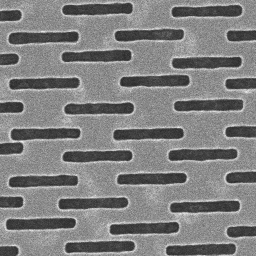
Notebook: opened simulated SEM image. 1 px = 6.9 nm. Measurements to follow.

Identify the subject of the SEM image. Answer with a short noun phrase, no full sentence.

a regular array of holes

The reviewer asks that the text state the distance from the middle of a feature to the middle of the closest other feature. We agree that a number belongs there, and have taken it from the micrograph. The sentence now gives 322 nm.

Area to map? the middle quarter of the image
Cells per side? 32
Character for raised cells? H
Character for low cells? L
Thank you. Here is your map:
HHHHHHHHHHHHHHHHHHHHHHHHHHHLLLLL
HHHHHHHHHHHHHHHHHHHHHHHHHHHHHHHH
HHHHHHHHHHHHHHHHHHHHHHHHHHHHHHHH
LLLHHHHHHHHHHHLLLLLLLLLLLLLLLLLH
LLLLHHHHHHHHHHLLLLLLLLLLLLLLLLLL
LLLLHHHHHHHHHHLLLLLLLLLLLLLLLLHH
HHHHHHHHHHHHHHHHHHHHHHHHHHHHHHHH
HHHHHHHHHHHHHHHHHHHHHHHHHHHHHHHH
HHHHHHHHHHHHHHHHHHHHHHHHHHHHHHHH
HHHHHHHHHHHHHHHHHHHHHHHHHHHHLLLL
LLLLLLLLLLLLLLLLLHHHHHHHHHHLLLLL
LLLLLLLLLLLLLLLLLHHHHHHHHHHHLLLL
HLLLLLLLLLLLLLHHHHHHHHHHHHHHHHHH
HHHHHHHHHHHHHHHHHHHHHHHHHHHHHHHH
HHHHHHHHHHHHHHHHHHHHHHHHHHHHHHHH
HHHHHHHHHHHHHHHHHHHHHHHHHHHHHHHH
LLLLHHHHHHHHHLLLLLLLLLLLLLLLLLHH
LLLLHHHHHHHHLLLLLLLLLLLLLLLLLLHH
LLLHHHHHHHHHLLLLLLLLLLLLLLLLLHHH
HHHHHHHHHHHHHHHHHHHHHHHHHHHHHHHH
HHHHHHHHHHHHHHHHHHHHHHHHHHHHHHHH
HHHHHHHHHHHHHHHLHHHHHHHHHHHLLLLL
LLLLLLLLLLLLLLLLLHHHHHHHHHLLLLLL
LLLLLLLLLLLLLLLLLHHHHHHHHHLLLLLL
HHLLLLLLHHHHHHHHHHHHHHHHHHHHHHHH
HHHHHHHHHHHHHHHHHHHHHHHHHHHHHHHH
HHHHHHHHHHHHHHHHHHHHHHHHHHHHHHHH
HHHHHHHHHHHHHHHLLLLLLLLLLLLLLLHH
LLLHHHHHHHHHHLLLLLLLLLLLLLLLLLLH
LLLLHHHHHHHHHLLLLLLLLLLLLLLLLLHH
LHLHHHHHHHHHHHHHHHHHHHHHHHHHHHHH
HHHHHHHHHHHHHHHHHHHHHHHHHHHHHHHH